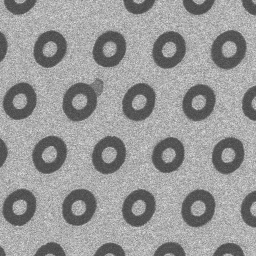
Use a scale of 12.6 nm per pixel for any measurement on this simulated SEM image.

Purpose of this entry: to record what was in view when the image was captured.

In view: a regular array of ring-shaped grooves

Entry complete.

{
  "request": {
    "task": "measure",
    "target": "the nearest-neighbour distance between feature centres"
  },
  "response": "753 nanometres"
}